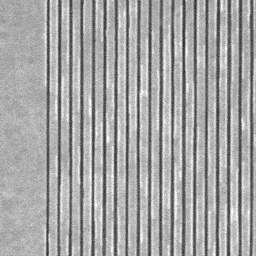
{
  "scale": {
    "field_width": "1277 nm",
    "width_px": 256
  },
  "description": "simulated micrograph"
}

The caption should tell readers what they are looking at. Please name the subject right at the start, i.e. parallel lines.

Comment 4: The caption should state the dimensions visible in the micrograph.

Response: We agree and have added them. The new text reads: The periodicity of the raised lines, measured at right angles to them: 56.5 nm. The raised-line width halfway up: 36.8 nanometers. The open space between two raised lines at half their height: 22.5 nm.